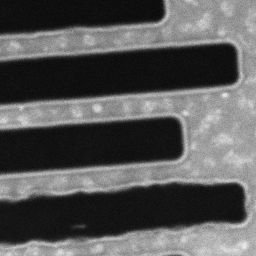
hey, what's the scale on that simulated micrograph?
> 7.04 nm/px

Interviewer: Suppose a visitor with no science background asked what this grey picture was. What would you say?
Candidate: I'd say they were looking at one or a few lines or trenches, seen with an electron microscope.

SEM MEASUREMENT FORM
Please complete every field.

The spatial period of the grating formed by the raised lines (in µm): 0.487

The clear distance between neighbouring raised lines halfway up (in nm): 146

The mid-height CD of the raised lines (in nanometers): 340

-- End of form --